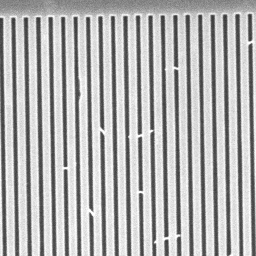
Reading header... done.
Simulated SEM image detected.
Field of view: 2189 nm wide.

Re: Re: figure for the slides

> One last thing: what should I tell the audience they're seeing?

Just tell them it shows parallel lines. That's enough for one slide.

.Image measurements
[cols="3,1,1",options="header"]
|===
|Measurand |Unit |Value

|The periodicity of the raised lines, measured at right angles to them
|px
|12.5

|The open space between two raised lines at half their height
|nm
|42.8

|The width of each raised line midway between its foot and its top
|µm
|0.0641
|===